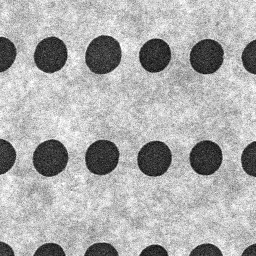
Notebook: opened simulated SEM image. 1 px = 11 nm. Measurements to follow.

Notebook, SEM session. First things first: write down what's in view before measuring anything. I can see a regular array of holes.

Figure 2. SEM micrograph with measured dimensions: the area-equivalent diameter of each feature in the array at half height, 390 nanometres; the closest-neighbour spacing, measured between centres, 569 nm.